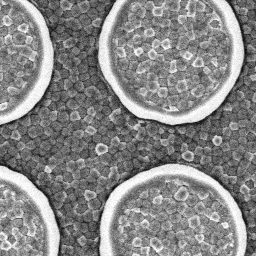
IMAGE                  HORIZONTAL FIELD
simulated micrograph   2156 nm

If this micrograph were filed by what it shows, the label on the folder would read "raised bodies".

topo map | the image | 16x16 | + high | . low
++.....+++++++..
+++....++++++++.
+++...+++++++++.
+++...+++++++++.
+++....++++++++.
+++....+++++++..
++......+++++...
...........+....
................
................
................
++......++++++..
++.....+++++++..
+++....++++++++.
+++...+++++++++.
+++....++++++++.